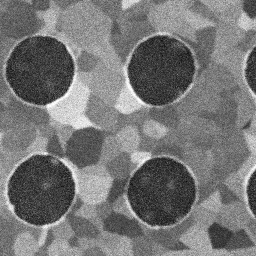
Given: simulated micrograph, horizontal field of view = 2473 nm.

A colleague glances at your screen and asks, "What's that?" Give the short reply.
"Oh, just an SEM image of holes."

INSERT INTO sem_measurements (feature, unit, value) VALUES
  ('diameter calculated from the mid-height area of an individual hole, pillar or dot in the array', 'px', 69.4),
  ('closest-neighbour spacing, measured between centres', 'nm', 1160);